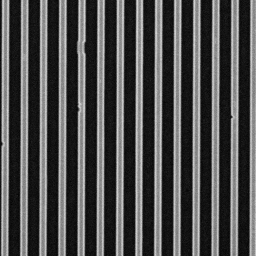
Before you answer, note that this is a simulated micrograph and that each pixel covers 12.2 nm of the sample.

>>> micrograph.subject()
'parallel lines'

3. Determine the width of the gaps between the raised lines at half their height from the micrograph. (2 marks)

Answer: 154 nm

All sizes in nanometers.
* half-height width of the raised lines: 71.6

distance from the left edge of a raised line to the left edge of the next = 233 nm